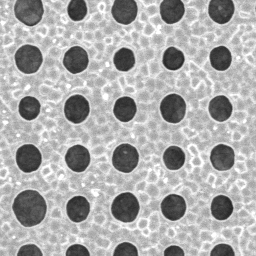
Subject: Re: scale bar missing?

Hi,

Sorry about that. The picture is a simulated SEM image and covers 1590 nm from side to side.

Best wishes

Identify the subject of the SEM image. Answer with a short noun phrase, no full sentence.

a regular array of holes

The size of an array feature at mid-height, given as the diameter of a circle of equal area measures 0.163 um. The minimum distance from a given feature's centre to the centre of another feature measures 0.295 micrometres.